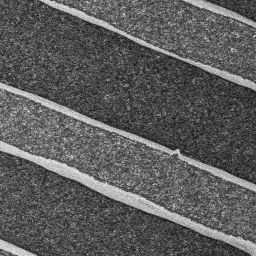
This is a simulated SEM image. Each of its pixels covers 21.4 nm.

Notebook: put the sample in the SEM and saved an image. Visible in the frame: one or a few lines or trenches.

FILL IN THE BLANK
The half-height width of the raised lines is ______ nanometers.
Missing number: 1230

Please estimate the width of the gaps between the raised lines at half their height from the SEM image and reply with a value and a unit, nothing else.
1.99 micrometres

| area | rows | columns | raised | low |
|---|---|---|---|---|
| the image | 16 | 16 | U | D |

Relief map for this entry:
DDDDUUUUUUUUUDDD
DDDDDDUUUUUUUUUU
DDDDDDDDUUUUUUUU
DDDDDDDDDDDUUUUU
DDDDDDDDDDDDDDUU
DDDDDDDDDDDDDDDD
UUUDDDDDDDDDDDDD
UUUUUUDDDDDDDDDD
UUUUUUUUDDDDDDDD
DUUUUUUUUUUDDDDD
DDDDUUUUUUUUUDDD
DDDDDDUUUUUUUUUD
DDDDDDDDUUUUUUUU
DDDDDDDDDDDUUUUU
DDDDDDDDDDDDDUUU
DDDDDDDDDDDDDDDD